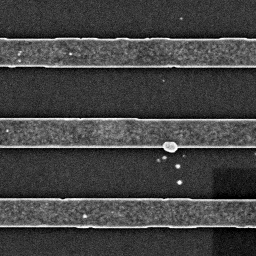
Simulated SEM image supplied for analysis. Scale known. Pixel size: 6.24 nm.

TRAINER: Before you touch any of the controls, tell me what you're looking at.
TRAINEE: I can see lines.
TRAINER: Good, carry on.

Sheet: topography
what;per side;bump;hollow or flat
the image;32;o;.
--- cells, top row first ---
................................
................................
................................
................................
................................
oooooooooooooooooooooooooooooooo
oooooooooooooooooooooooooooooooo
oooooooooooooooooooooooooooooooo
................................
................................
................................
................................
................................
................................
................................
oooooooooooooooooooooooooooooooo
oooooooooooooooooooooooooooooooo
oooooooooooooooooooooooooooooooo
....................ooo.........
................................
................................
................................
................................
................................
................................
oooooooooooooooooooooooooooooooo
oooooooooooooooooooooooooooooooo
oooooooooooooooooooooooooooooooo
................................
................................
................................
................................